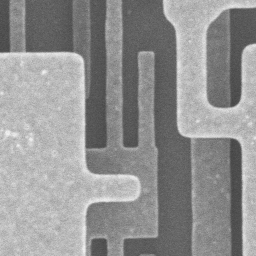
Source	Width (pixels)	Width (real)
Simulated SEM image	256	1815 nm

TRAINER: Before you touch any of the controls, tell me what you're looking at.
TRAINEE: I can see wiring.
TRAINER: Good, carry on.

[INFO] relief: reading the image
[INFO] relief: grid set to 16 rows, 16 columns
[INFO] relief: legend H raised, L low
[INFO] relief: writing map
LLLLLLLLLLHHHHHL
LLLLLLLLLLLHHLLL
LLLLLLLLLLLHHLLL
HHHHHLLLLLLHHLLH
HHHHHLLLLLLHHLLH
HHHHHLLLLLLHHLLH
HHHHHLLLLLLHHLLH
HHHHHLLLLLLHHHHH
HHHHHLLLLLLLHHHH
HHHHHLLLLLLLLLLH
HHHHHHLLLLLLLLLH
HHHHHHHHHLLLLLLH
HHHHHHHHLLLLLLLH
HHHHHLLLLLLLLLLH
HHHHHLLLLLLLLLLH
HHHHHLLLLLLLLLLH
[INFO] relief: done